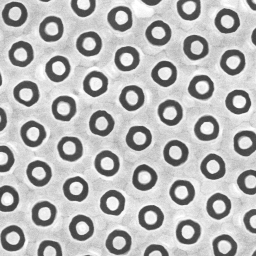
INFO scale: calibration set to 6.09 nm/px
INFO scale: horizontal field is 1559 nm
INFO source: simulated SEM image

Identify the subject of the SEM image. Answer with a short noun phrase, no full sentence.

a regular array of ring-shaped grooves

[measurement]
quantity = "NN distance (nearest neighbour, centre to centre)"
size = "240 nm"